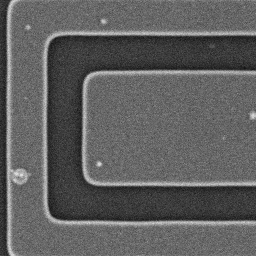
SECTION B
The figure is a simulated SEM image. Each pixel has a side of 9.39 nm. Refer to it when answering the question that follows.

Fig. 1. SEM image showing groups of lines, slits or small figures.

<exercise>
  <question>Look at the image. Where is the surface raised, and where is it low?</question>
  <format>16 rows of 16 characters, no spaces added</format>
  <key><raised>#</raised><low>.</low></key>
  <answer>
.###############
################
###.............
.##.............
.##......######.
###..###########
###..###########
###..###########
###..###########
###..###########
###..###########
.##...##########
.##.............
.##.............
.###############
.###############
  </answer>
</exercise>